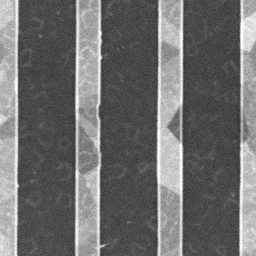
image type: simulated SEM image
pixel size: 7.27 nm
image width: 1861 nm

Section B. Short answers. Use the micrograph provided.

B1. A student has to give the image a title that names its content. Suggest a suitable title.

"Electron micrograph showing one or a few lines or trenches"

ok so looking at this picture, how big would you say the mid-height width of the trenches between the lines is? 437 nanometers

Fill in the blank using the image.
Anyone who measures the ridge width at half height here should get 166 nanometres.